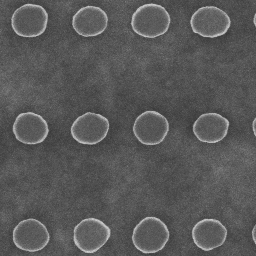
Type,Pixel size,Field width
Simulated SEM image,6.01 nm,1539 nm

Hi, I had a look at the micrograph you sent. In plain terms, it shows a regular array of raised bodies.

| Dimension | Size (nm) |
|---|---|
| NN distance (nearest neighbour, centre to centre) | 358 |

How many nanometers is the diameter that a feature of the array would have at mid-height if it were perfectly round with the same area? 202